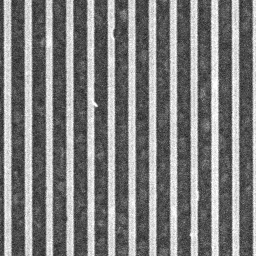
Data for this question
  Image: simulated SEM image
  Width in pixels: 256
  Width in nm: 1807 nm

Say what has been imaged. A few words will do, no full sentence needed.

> parallel lines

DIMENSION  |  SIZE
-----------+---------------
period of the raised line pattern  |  146 nanometers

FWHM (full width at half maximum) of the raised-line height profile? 40.6 nanometers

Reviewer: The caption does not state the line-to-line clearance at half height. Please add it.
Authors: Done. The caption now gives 14.5 px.